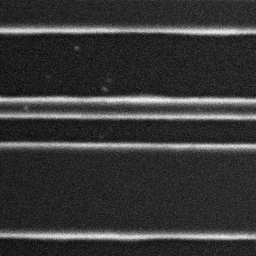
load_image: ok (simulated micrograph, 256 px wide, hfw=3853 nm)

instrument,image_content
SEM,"lines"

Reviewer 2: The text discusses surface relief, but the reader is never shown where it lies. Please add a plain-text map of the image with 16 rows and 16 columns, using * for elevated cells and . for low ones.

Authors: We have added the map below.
****************
****************
................
................
................
................
****************
****************
****************
****************
****************
****************
****************
****************
****************
................